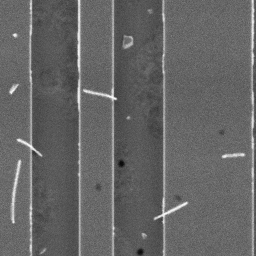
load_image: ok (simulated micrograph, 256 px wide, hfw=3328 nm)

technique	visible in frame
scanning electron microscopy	lines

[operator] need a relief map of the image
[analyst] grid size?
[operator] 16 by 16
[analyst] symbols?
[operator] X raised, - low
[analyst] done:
XX---XX---XXXXXX
XX---XX---XXXXXX
XX---XX---XXXXXX
XX---XX---XXXXXX
XX---XX---XXXXXX
XX---XX---XXXXXX
XX---XX---XXXXXX
XX---XX---XXXXXX
XX---XX---XXXXXX
XX---XX---XXXXXX
XX---XX---XXXXXX
XX---XX---XXXXXX
XX---XX---XXXXXX
XX---XX---XXXXXX
XX---XX---XXXXXX
XX---XX---XXXXXX